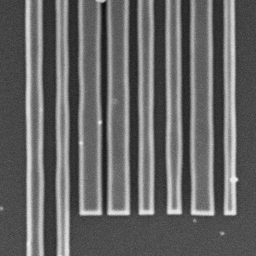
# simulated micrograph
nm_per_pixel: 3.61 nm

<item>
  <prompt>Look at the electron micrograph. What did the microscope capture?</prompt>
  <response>groups of lines, slits or small figures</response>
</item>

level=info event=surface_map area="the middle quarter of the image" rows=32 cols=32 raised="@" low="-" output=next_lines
@---@@@@@--@@@@@---@@@----@@@---
@---@@@@@--@@@@@---@@@----@@@---
@---@@@@@--@@@@@---@@@----@@@---
@---@@@@@--@@@@@---@@@----@@@---
@---@@@@@--@@@@@---@@@----@@@---
@---@@@@@--@@@@@---@@@----@@@---
@---@@@@@--@@@@@---@@@----@@@---
@---@@@@@--@@@@@---@@@----@@@---
@---@@@@@--@@@@@---@@@----@@@---
@---@@@@@--@@@@@---@@@----@@@---
@---@@@@@--@@@@@---@@@----@@@---
@---@@@@@--@@@@@---@@@----@@@---
@---@@@@@--@@@@@---@@@----@@@---
@---@@@@@--@@@@@---@@@----@@@---
@---@@@@@--@@@@@---@@@----@@@---
@---@@@@@--@@@@@---@@@----@@@---
@---@@@@@--@@@@@---@@@----@@@---
@---@@@@@--@@@@@---@@@----@@@---
@---@@@@@--@@@@@---@@@----@@@---
@---@@@@@--@@@@@---@@@----@@@---
@---@@@@@--@@@@@---@@@----@@@---
@---@@@@@--@@@@@---@@@----@@@---
@---@@@@@--@@@@@---@@@----@@@---
@---@@@@@--@@@@@---@@@----@@@---
@---@@@@@--@@@@@---@@@----@@@---
@---@@@@@--@@@@@---@@@----@@@---
@---@@@@@--@@@@@---@@@----@@@---
@---@@@@@--@@@@@---@@@----@@@---
@---@@@@@--@@@@@---@@@----@@@---
@---@@@@@--@@@@@---@@@----@@@---
@---@@@@@--@@@@@---@@@----@@@---
@---@@@@@--@@@@@---@@@----@@@---